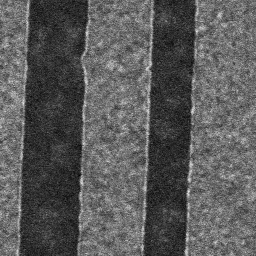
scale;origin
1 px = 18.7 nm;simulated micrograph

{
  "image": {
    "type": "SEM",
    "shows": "one or a few lines or trenches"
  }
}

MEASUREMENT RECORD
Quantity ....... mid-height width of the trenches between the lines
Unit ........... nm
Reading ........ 963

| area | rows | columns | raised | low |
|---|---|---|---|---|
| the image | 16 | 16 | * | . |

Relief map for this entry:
**....****..****
**...****...****
**...****...****
**...****...****
**...****...****
**...****...****
*....****...****
*....****...****
*....****...****
*....****...****
*....****...****
*....****...****
*....****...****
*....****...****
*....****...****
*....****...****